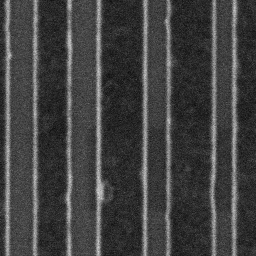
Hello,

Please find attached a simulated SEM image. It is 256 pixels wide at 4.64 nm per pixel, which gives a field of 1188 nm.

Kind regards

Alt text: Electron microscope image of one or a few lines or trenches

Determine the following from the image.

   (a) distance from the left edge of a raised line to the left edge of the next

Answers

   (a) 322 nm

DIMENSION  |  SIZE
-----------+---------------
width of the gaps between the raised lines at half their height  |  0.111 um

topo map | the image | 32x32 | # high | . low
#...#####...######...######..###
#...#####...######...######..###
#...#####...######...######..###
#...#####...######...######..###
#...#####...######...######..###
#...#####...######...######..###
#...#####...######...######..###
#...#####...######...######..###
#...#####...######...######..###
#...#####...######...######..###
#...#####...######...######..###
#...#####...######...######..###
#...#####...######...######..###
#...#####...######...######..###
#...#####...######...######..###
#...#####...######...######..###
#...#####...######...######..###
#...#####...######...######..###
#...#####...######...######..###
#...#####...######...######..###
#...#####...######...######..###
#...#####...######...######..###
#...#####...######...######..###
#...#####...######...######..###
#...#####...######...######..###
#...#####...######...######..###
#...#####...######...######..###
#...#####...######...######..###
#...#####...######...######..###
#...#####...######...######..###
#...#####...######...######..###
#...#####...######...######..###